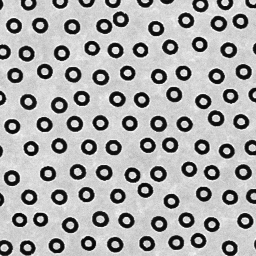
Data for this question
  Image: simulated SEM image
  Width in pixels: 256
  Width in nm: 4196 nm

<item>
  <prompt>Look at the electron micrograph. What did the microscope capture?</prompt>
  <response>a regular array of ring-shaped grooves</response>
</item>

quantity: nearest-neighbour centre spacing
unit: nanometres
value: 400